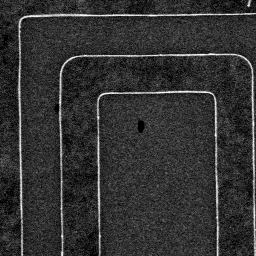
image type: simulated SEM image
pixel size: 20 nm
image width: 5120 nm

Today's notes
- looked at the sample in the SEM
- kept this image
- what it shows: groups of lines, slits or small figures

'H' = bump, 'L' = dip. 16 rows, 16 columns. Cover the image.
HHHHHHHHHHHHHHHH
HLLLLLLLLLLLLLLL
HLLLLLLLLLLLLLLL
HLLLLLLLLHHHHHHL
HLLLHHHHHHHHHHHH
HLLLHHHHHHHHHHHH
HLLLHHLLLLLLLHHH
HLLLHHLLLLLLLLHH
HLLLHHLLLLLLLLHH
HLLLHHLLLLLLLLHH
HLLLHHLLLLLLLLHH
HLLLHHLLLLLLLLHH
HLLLHHLLLLLLLLHH
HLLLHHLLLLLLLLHH
HLLLHHLLLLLLLLHH
HLLLHHLLLLLLLLHH